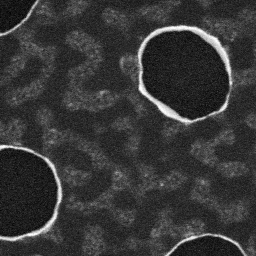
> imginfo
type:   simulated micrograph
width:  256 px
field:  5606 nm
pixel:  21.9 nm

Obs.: holes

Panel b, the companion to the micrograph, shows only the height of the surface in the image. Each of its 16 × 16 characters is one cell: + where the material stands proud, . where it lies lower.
..++++++++++++++
.+++++++++++++++
+++++++++....+++
+++++++++.....++
+++++++++.....++
+++++++++.....++
++++++++++....++
++++++++++++++++
++++++++++++++++
..++++++++++++++
...+++++++++++++
....++++++++++++
....++++++++++++
...+++++++++++++
..++++++++++++++
+++++++++++....+